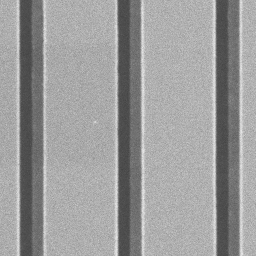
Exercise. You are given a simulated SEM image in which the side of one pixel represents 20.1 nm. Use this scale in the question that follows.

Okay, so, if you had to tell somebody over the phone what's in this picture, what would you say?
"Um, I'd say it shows lines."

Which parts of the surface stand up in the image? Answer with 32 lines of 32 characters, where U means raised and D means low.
UUDDDUUUUUUUUUUDDDUUUUUUUUUDDDUU
UUDDDUUUUUUUUUUDDDUUUUUUUUUDDDUU
UUDDDDUUUUUUUUUDDDUUUUUUUUUDDDUU
UUDDDDUUUUUUUUUDDDUUUUUUUUUDDDUU
UUDDDDUUUUUUUUUDDDUUUUUUUUUDDDUU
UUDDDUUUUUUUUUUDDDUUUUUUUUUDDDUU
UUDDDUUUUUUUUUUDDDUUUUUUUUUDDDUU
UUDDDDUUUUUUUUUDDDUUUUUUUUUDDDUU
UUDDDDUUUUUUUUUDDDUUUUUUUUUDDDUU
UUDDDDUUUUUUUUUDDDUUUUUUUUUDDDUU
UUDDDUUUUUUUUUUDDDUUUUUUUUUDDDUU
UUDDDUUUUUUUUUUDDDUUUUUUUUUDDDUU
UUDDDDUUUUUUUUUDDDUUUUUUUUUDDDUU
UUDDDDUUUUUUUUUDDDUUUUUUUUUDDDUU
UUDDDDUUUUUUUUUDDDUUUUUUUUUDDDUU
UUDDDDUUUUUUUUUDDDUUUUUUUUUDDDUU
UUDDDDUUUUUUUUUDDDUUUUUUUUUDDDUU
UUDDDDUUUUUUUUUDDDUUUUUUUUUDDDUU
UUDDDDUUUUUUUUUDDDUUUUUUUUUDDDUU
UUDDDDUUUUUUUUUDDDUUUUUUUUUDDDUU
UUDDDDUUUUUUUUUDDDUUUUUUUUUDDDUU
UUDDDDUUUUUUUUUDDDUUUUUUUUUDDDUU
UUDDDDUUUUUUUUUDDDUUUUUUUUUDDDUU
UUDDDDUUUUUUUUUDDDUUUUUUUUUDDDUU
UUDDDDUUUUUUUUUDDDUUUUUUUUUDDDUU
UUDDDDUUUUUUUUUDDDUUUUUUUUUDDDUU
UUUDDDUUUUUUUUUDDDUUUUUUUUUDDDUU
UUDDDDUUUUUUUUUDDDUUUUUUUUUDDDUU
UUDDDDUUUUUUUUUDDDUUUUUUUUUDDDUU
UUDDDDUUUUUUUUUDDDUUUUUUUUUDDDUU
UUDDDDUUUUUUUUUDDDUUUUUUUUUDDDUU
UUDDDDUUUUUUUUUDDDUUUUUUUUUDDDUU